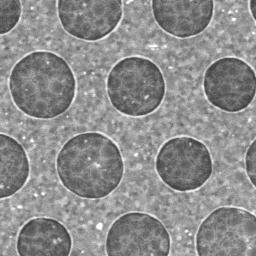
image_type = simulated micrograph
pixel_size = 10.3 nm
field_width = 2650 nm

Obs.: holes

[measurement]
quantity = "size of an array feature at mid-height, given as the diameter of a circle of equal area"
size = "63.1 px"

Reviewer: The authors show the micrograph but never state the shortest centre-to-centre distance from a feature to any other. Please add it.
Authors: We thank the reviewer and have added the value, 90.9 pixels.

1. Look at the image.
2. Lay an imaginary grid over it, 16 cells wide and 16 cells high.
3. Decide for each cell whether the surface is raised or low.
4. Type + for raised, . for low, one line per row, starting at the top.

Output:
.+++....++...+++
.+++...+++...+++
++++++++++++++++
++..++++++++++++
+...+++...+++...
+....++...+++...
+...+++...+++...
++++++++++++++++
+++++..+++++++++
..++...+++...++.
..++....++...++.
.+++...+++...+++
++++++++++++++++
++++++++.++++...
+...+++...++....
+...+++....+....